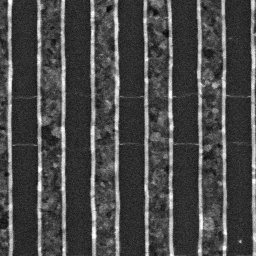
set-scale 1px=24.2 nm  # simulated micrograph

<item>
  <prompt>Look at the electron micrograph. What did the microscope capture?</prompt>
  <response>wiring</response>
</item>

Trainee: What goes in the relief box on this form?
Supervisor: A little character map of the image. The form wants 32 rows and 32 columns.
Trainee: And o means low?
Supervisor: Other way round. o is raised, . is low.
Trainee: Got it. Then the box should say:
o....ooo....oo....ooo....ooo....
o....ooo....oo....ooo....ooo....
o....ooo....oo....ooo....ooo....
o....ooo....oo....ooo....ooo....
o....ooo....oo....ooo....ooo....
o....ooo....oo....ooo....ooo....
o....ooo....oo....ooo....ooo....
o....ooo....oo....ooo....ooo....
o....ooo....ooo...ooo....ooo....
o....ooo....ooo...ooo....ooo....
o....ooo....ooo...ooo....ooo....
o....ooo....ooo...ooo....ooo....
o....ooo....ooo...ooo....ooo....
o....ooo....ooo...ooo....ooo....
o....ooo....ooo...ooo....ooo....
o....ooo....oo....ooo....ooo....
o....ooo....ooo...ooo....ooo....
o....ooo....ooo...ooo....ooo....
o....ooo....ooo...ooo....ooo....
o....ooo....ooo...ooo....ooo....
o....ooo....ooo...ooo....ooo....
o....ooo....oo....ooo....ooo....
o....ooo....ooo...ooo....ooo....
o....ooo....ooo...ooo....ooo....
o....ooo....ooo...ooo....ooo....
o....ooo....ooo...ooo....ooo....
o....ooo....ooo...ooo....ooo....
o....ooo....ooo...ooo....ooo....
o....ooo....ooo...ooo....ooo....
o....ooo....ooo...ooo....ooo....
o....ooo....ooo...ooo....ooo....
o....ooo....ooo...ooo....ooo....